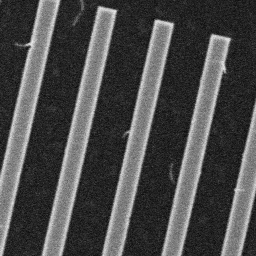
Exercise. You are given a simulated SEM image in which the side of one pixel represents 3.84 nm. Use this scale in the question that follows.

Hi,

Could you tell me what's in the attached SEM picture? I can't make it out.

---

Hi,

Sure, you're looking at parallel lines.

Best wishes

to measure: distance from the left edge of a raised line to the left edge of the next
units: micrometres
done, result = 0.223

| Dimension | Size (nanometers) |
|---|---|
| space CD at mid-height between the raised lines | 151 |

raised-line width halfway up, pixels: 19.3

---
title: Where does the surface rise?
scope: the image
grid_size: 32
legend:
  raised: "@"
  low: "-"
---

-----@@-------------------------
-----@@-----@@------------------
----@@@-----@@------------------
----@@@-----@@-----@@@----------
----@@-----@@@-----@@-----------
----@@-----@@@-----@@-----@@@---
----@@-----@@-----@@@-----@@----
---@@@-----@@-----@@@-----@@----
---@@@-----@@-----@@-----@@@----
---@@-----@@@-----@@-----@@@----
---@@-----@@------@@-----@@@----
--@@@-----@@-----@@@-----@@-----
--@@@-----@@-----@@@-----@@-----
--@@-----@@@-----@@-----@@@-----
--@@-----@@@-----@@-----@@@-----
-@@@-----@@------@@-----@@-----@
-@@@-----@@-----@@@-----@@-----@
-@@------@@-----@@-----@@@-----@
-@@-----@@@-----@@-----@@@-----@
-@@-----@@------@@-----@@@----@@
@@@-----@@-----@@@-----@@-----@@
@@@-----@@-----@@@----@@@-----@@
@@-----@@@-----@@-----@@@-----@@
@@-----@@@-----@@-----@@@-----@@
@@-----@@------@@-----@@-----@@@
@@-----@@-----@@@-----@@-----@@@
@------@@-----@@-----@@@-----@@-
@-----@@@-----@@-----@@@-----@@-
@-----@@-----@@@-----@@-----@@@-
@-----@@-----@@@-----@@-----@@@-
@-----@@-----@@------@@-----@@--
-----@@@-----@@-----@@@-----@@--